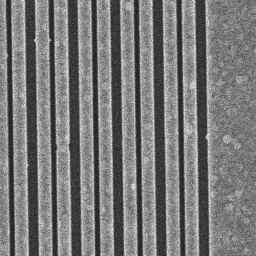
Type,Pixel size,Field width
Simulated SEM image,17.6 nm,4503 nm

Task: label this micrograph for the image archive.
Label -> parallel lines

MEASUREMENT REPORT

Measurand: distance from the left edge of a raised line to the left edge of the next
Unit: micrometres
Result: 0.374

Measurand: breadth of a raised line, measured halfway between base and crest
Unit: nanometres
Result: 226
